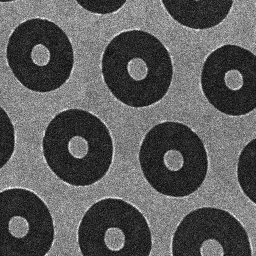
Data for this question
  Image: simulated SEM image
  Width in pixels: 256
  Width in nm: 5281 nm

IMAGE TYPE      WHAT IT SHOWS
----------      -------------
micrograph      ring-shaped grooves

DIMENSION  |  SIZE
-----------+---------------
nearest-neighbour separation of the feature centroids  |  97.1 pixels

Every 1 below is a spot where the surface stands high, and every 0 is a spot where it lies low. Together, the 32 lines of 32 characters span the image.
11111111110000001111000000000111
11111111111000111111100000000111
11100011111111111111110000001111
11000000111111111111111100111111
10000000111111100001111111111111
10000000011111000000111111111111
10001100011110000000011111100001
10001100011110000100011111000000
10000000011110001100001110000000
11000000011110001100001110001100
11100000111110000000011110001100
11111011111111000000011110000000
11111111111111100000111111000000
11111111111111111111111111100000
01111110000011111111111111111111
00111100000001111111000111111111
00111100000000111110000011111111
00111000011000111100000001111111
00111000011000111100000000111100
01111100010000111000011000111100
01111100000000111000011000111100
11111110000001111100000000111100
11111111000011111100000000111100
11111111111111111110000001111100
00000111111111111111100111111110
00000011111100001111111111111111
00000011111000000011111100001111
01100001110000000011111000000011
01110001110000000001110000000011
00100001110001100001110000000001
00000001110001100001100001100001
00000011110000000001100001110001